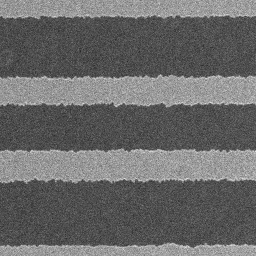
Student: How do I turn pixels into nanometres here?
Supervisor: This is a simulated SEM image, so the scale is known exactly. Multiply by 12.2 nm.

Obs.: one or a few lines or trenches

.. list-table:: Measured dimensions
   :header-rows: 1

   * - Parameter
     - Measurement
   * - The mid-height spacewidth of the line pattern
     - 741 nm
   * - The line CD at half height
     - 336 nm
